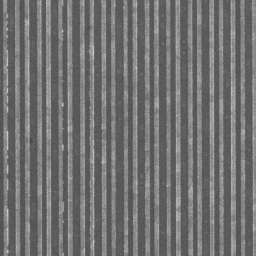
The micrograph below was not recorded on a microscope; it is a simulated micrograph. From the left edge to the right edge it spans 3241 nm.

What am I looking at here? parallel lines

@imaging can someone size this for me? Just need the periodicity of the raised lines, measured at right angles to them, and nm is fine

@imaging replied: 137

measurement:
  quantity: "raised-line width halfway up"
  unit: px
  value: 3.63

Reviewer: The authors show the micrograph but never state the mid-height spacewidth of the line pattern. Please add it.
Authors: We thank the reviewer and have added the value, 101 nm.